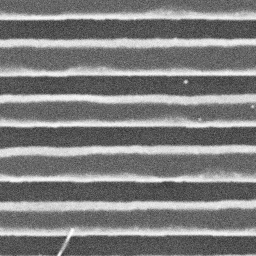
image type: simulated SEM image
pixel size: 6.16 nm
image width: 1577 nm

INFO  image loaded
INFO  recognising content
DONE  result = lines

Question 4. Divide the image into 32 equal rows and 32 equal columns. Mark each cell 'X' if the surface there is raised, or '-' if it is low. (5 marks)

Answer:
XXXXXXXXXXXXXXXXXXXXXXXXXXXXXXXX
XXXXXXXXXXXXXXXXXXXXXXXXXXXXXXXX
--------------------------------
--------------------------------
--------------------------------
XXXXXXXXXXXXXXXXXXXXXXXXXXXXXXXX
XXXXXXXXXXXXXXXXXXXXXXXXXXXXXXXX
XXXXXXXXXXXXXXXXXXXXXXXXXXXXXXXX
XXXXXXXXXXXXXXXXXXXXXXXXXXXXXXXX
--------------------------------
--------------------------------
--------------------------------
XXXXXXXXXXXXXXXXXXXXXXXXXXXXXXXX
XXXXXXXXXXXXXXXXXXXXXXXXXXXXXXXX
XXXXXXXXXXXXXXXXXXXXXXXXXXXXXXXX
-XXXXXXXXXXXXXXXXXX----XXXXXXXXX
--------------------------------
--------------------------------
--------------------------------
XXXXXXXXXXXXXXXXXXXXXXXXXXXXXXXX
XXXXXXXXXXXXXXXXXXXXXXXXXXXXXXXX
XXXXXXXXXXXXXXXXXXXXXXXXXXXXXXXX
-XX--------------X-XXXX---------
--------------------------------
--------------------------------
----------------------------XXXX
XXXXXXXXXXXXXXXXXXXXXXXXXXXXXXXX
XXXXXXXXXXXXXXXXXXXXXXXXXXXXXXXX
XXXXXXXXXXXXXXXXXXXXXXXXXXXXXXXX
--------------------------------
--------------------------------
--------------------------------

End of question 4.